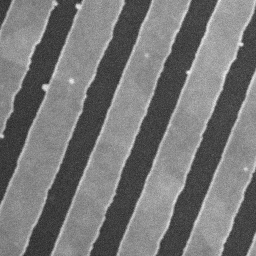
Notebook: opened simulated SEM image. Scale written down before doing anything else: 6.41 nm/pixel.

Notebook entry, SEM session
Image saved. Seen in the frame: lines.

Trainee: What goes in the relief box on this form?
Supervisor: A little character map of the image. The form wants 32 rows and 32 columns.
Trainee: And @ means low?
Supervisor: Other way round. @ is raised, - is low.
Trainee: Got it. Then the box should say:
-@@@@@@---@@@@@----@@@@@---@@@@@
-@@@@@----@@@@@---@@@@@----@@@@@
-@@@@@---@@@@@@---@@@@@---@@@@@-
@@@@@@---@@@@@----@@@@----@@@@@-
@@@@@---@@@@@@---@@@@@----@@@@--
@@@@@---@@@@@@---@@@@@---@@@@@--
@@@@----@@@@@----@@@@----@@@@@--
@@@@---@@@@@@---@@@@@---@@@@@---
@@@@---@@@@@----@@@@----@@@@@---
@@@----@@@@@---@@@@@----@@@@----
@@@---@@@@@----@@@@@---@@@@@---@
@@----@@@@@---@@@@@----@@@@@---@
@@---@@@@@@---@@@@@---@@@@@----@
@@---@@@@@----@@@@----@@@@@---@@
@----@@@@@---@@@@@---@@@@@----@@
@---@@@@@----@@@@@---@@@@@---@@@
----@@@@@----@@@@----@@@@----@@@
---@@@@@@---@@@@@---@@@@@----@@@
---@@@@@----@@@@----@@@@@---@@@@
---@@@@@---@@@@@----@@@@----@@@@
--@@@@@@---@@@@@---@@@@@---@@@@@
--@@@@@----@@@@----@@@@@---@@@@@
-@@@@@@---@@@@@---@@@@@----@@@@-
-@@@@@----@@@@@---@@@@@---@@@@@-
-@@@@@---@@@@@----@@@@----@@@@--
@@@@@@---@@@@@---@@@@@---@@@@@--
@@@@@----@@@@----@@@@@---@@@@@--
@@@@@---@@@@@---@@@@@----@@@@---
@@@@----@@@@@---@@@@@---@@@@@---
@@@@---@@@@@----@@@@----@@@@----
@@@----@@@@@---@@@@@---@@@@@---@
@@@----@@@@----@@@@@---@@@@@---@